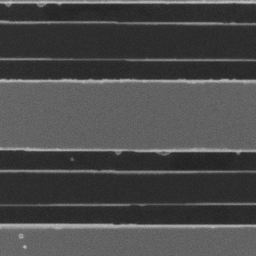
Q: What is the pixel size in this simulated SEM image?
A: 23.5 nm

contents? lines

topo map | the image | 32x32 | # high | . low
................................
................................
................................
################################
################################
################################
################################
......................#.########
................................
................................
################################
################################
################################
################################
################################
################################
################################
################################
################################
................................
................................
################################
################################
################################
################################
################################
................................
................................
################################
################################
################################
################################